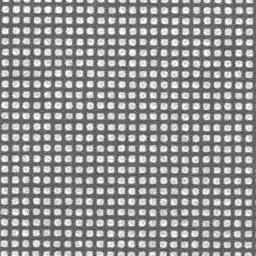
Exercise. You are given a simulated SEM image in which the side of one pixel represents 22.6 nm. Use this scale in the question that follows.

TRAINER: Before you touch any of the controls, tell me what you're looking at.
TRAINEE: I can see a regular array of raised bodies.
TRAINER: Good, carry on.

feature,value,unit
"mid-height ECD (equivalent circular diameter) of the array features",146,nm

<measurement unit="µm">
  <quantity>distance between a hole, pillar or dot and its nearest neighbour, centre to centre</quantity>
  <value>0.233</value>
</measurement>